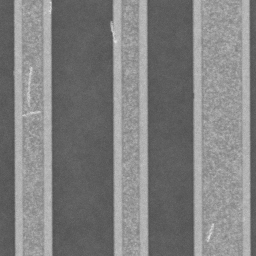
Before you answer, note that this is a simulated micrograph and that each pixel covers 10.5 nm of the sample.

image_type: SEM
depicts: one or a few lines or trenches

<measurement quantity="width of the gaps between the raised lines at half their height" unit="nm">651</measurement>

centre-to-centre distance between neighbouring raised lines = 996 nanometres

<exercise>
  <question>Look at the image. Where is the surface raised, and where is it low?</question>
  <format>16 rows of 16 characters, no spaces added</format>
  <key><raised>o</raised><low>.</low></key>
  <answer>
.oo....oo...ooo.
.oo....oo...ooo.
.oo....oo...ooo.
.oo....oo...ooo.
.oo....oo...ooo.
.oo....oo...ooo.
.oo....oo...ooo.
.oo....oo...ooo.
.oo....oo...ooo.
.oo....oo...ooo.
.oo....oo...ooo.
.oo....oo...ooo.
.oo....oo...ooo.
.oo....oo...ooo.
.oo....oo...ooo.
.oo....oo...ooo.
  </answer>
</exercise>